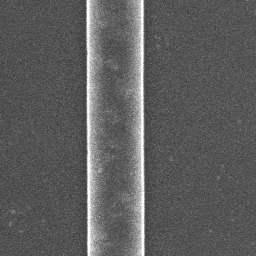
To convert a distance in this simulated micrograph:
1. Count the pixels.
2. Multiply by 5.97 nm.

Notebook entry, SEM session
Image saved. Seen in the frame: one or a few lines or trenches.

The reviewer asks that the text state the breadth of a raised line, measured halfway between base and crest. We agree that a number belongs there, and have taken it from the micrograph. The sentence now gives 0.329 um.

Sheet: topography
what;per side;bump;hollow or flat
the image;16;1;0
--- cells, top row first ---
0000001110000000
0000001110000000
0000001110000000
0000001110000000
0000001110000000
0000001110000000
0000001110000000
0000001110000000
0000001110000000
0000001110000000
0000001110000000
0000001110000000
0000001110000000
0000001110000000
0000001110000000
0000001110000000